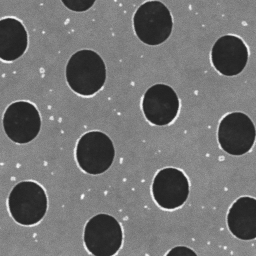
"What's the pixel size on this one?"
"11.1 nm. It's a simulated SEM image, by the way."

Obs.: holes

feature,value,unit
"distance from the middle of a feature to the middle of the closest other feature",896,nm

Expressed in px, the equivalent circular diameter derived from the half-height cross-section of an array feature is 40.2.